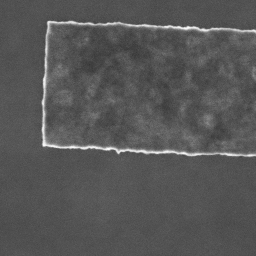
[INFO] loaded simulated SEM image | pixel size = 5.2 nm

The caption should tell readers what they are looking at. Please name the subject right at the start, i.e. one or a few lines or trenches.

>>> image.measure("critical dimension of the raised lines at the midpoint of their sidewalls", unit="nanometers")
655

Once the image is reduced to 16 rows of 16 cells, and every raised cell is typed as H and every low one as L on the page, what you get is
LLLLLLLLLLLLLLLL
LLLHHHHHLLLLLLLL
LLLHHHHHHHHHHHHH
LLLHHHHHHHHHHHHH
LLLHHHHHHHHHHHHH
LLLHHHHHHHHHHHHH
LLLHHHHHHHHHHHHH
LLLHHHHHHHHHHHHH
LLLHHHHHHHHHHHHH
LLLLLLLLLHHHHHHH
LLLLLLLLLLLLLLLL
LLLLLLLLLLLLLLLL
LLLLLLLLLLLLLLLL
LLLLLLLLLLLLLLLL
LLLLLLLLLLLLLLLL
LLLLLLLLLLLLLLLL